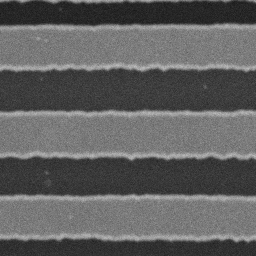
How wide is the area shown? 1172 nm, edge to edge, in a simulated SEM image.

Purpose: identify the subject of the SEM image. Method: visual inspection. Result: lines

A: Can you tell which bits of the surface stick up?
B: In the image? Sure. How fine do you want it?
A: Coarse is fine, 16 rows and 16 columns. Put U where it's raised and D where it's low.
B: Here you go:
DDDDDDDDDDDDDDDD
DDDDDDDDDDDDDDUD
UUUUUUUUUUUUUUUU
UUUUUUUUUUUUUUUU
DDDDDDDDDDDDDDDD
DDDDDDDDDDDDDDDD
DDDDDDDDDDDDDDDD
UUUUUUUUUUUUUUUU
UUUUUUUUUUUUUUUU
UUUUUUUUUUUUUUUU
DDDDDDDDDDDDDDDD
DDDDDDDDDDDDDDDD
UUUUUUUUUUUUUUUU
UUUUUUUUUUUUUUUU
UUUUUUUUUUUUUUUU
DDDDDDDDDDDDDDDD